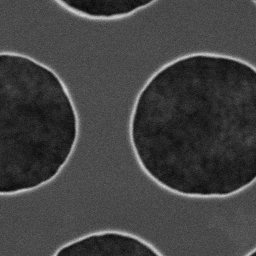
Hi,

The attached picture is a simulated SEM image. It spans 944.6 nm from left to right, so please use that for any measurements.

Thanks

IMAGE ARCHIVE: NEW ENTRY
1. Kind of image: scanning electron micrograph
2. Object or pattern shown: holes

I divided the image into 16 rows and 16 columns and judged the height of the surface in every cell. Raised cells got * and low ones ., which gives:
****.....*******
****************
****************
.***********.***
...*******......
....*****.......
....*****.......
.....***........
.....***........
....*****.......
....*****.......
...*******.....*
****************
****************
****************
****.....*******